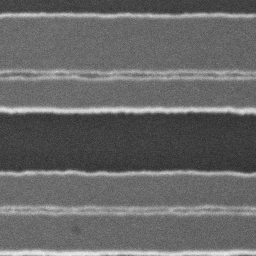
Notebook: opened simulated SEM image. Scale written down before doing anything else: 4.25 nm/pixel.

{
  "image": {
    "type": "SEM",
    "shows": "lines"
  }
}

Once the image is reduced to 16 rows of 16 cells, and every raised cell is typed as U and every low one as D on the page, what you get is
DDDDDDDDDDDDDDDD
UUUUUUUUUUUUUUUU
UUUUUUUUUUUUUUUU
UUUUUUUUUUUUUUUU
UUUUUUUUUUUUUUUU
UUUUUUUUUUUUUUUU
UUUUUUUUUUUUUUUU
DDDDDDDDDDDDDDDD
DDDDDDDDDDDDDDDD
DDDDDDDDDDDDDDDD
DDDDDDDDDDDDDDDD
UUUUUUUUUUUUUUUU
UUUUUUUUUUUUUUUU
UUUUUUUUUUUUUUUU
UUUUUUUUUUUUUUUU
UUUUUUUUUUUUUUUU